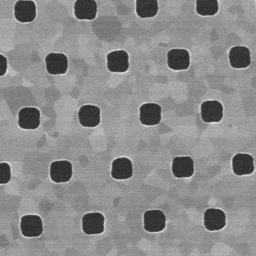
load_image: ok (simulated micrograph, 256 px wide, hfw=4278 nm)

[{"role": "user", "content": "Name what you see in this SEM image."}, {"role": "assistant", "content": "a regular array of holes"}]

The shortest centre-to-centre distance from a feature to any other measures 1010 nm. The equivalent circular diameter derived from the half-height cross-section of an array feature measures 403 nm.